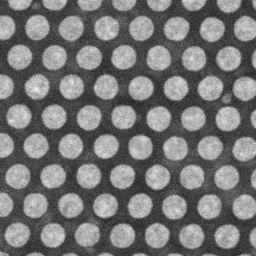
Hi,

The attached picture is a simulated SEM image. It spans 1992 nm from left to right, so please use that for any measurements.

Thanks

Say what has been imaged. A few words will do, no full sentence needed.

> a regular array of raised bodies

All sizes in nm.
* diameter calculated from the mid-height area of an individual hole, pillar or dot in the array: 182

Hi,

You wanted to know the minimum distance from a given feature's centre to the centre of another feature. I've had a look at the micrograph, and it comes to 0.263 micrometres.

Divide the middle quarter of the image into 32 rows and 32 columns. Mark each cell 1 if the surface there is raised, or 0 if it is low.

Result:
00001111000001111000011111000011
00000000000000000000000000000000
00000000000000000000000000000000
11110000011100000011000000011000
11111000111110000111110000111100
11111000111110000111110001111110
11111000111110001111110001111110
11110000111110000111110001111100
01100000001100000011100000111100
00000000000000000000000000000000
00000000000000000000000000000000
00001111100001111000001111000001
00001111100011111100011111000011
00011111100011111100011111100011
00001111100011111000011111000111
00001111000001111000011111000011
00000000000000000000000100000001
00000000000000000000000000000000
11110000011110000111100000011000
11110000111110000111110000111100
11110000111110001111110001111110
11110000111110001111110001111110
11110000111110000111110001111110
00000000001000000011000000111100
00000000000000000000000000000000
00000111000000110000001100000000
00001111000011111000011111000011
00011111100011111000011111000111
00011111100011111000011111000111
00001111100011111000011111000111
00001111000001110000011110000011
00000000000000000000000000000000